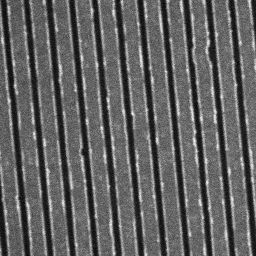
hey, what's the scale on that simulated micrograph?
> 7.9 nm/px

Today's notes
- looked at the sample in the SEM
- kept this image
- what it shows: parallel lines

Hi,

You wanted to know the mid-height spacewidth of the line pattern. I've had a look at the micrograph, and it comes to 0.0511 um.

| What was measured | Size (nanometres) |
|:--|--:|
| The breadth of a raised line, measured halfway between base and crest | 124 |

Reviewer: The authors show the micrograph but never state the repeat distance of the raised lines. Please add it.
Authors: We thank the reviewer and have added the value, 179 nm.